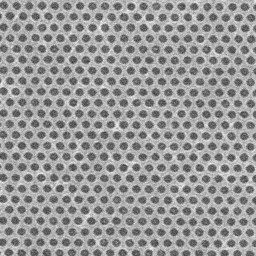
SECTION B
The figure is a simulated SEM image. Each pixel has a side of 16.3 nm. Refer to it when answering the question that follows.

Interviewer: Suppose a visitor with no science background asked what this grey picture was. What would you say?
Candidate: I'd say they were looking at a regular array of holes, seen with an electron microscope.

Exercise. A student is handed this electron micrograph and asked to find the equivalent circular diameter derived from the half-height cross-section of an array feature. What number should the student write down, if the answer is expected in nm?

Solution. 150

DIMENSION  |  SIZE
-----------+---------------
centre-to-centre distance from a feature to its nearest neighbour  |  198 nm